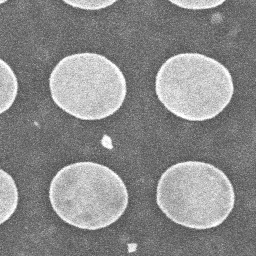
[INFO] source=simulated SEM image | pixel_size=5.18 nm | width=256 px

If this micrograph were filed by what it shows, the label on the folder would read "raised bodies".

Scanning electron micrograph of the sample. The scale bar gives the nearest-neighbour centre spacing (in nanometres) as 552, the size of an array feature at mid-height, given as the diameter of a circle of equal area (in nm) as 367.